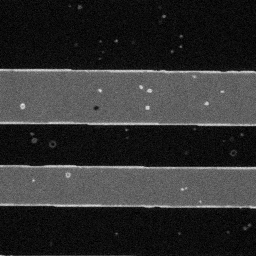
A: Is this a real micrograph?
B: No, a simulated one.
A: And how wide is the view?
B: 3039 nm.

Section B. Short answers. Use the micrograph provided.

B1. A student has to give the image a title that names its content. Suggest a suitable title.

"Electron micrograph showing lines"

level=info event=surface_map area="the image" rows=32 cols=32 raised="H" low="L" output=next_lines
LLLLLLLLLLLLLLLLLLLLLLLLLLLLLLLL
LLLLLLLLLLLLLLLLLLLLLLLLLLLLLLLL
LLLLLLLLLLLLLLLLLLLLLLLLLLLLLLLL
LLLLLLLLLLLLLLLLLLLLLLLLLLLLLLLL
LLLLLLLLLLLLLLLLLLLLLLLLLLLLLLLL
LLLLLLLLLLLLLLLLLLLLLLLLLLLLLLLL
LLLLLLLLLLLLLLLLLLLLLLLLLLLLLLLL
LLLLLLLLLLLLLLLLLLLLLLLLLLLLLLLL
LLLLLLLLLLLLLLLLLLLLLLLLLLLLLLLL
HHHHHHHHHHHHHHHHHHHHHHHHHHHHHHHH
HHHHHHHHHHHHHHHHHHHHHHHHHHHHHHHH
HHHHHHHHHHHHHHHHHHHHHHHHHHHHHHHH
HHHHHHHHHHHHHHHHHHHHHHHHHHHHHHHH
HHHHHHHHHHHHHHHHHHHHHHHHHHHHHHHH
HHHHHHHHHHHHHHHHHHHHHHHHHHHHHHHH
LLLLLLLLLLLLLHHHHHHHHHHHHHHHHHHH
LLLLLLLLLLLLLLLLLLLLLLLLLLLLLLLL
LLLLLLLLLLLLLLLLLLLLLLLLLLLLLLLL
LLLLLLLLLLLLLLLLLLLLLLLLLLLLLLLL
LLLLLLLLLLLLLLLLLLLLLLLLLLLLLLLL
LLLLLLLLLLLLLLLLLLLLLLLLLLLLLLLL
HHHHHHHHHHHHHHHHHHHHHHHHHHHHHHHH
HHHHHHHHHHHHHHHHHHHHHHHHHHHHHHHH
HHHHHHHHHHHHHHHHHHHHHHHHHHHHHHHH
HHHHHHHHHHHHHHHHHHHHHHHHHHHHHHHH
HHHHHHHHHHHHHHHHHHHHHHHHHHHHHHHH
LLLLLLLLLLLLLLLLLLLLLLLLLLLLLLLL
LLLLLLLLLLLLLLLLLLLLLLLLLLLLLLLL
LLLLLLLLLLLLLLLLLLLLLLLLLLLLLLLL
LLLLLLLLLLLLLLLLLLLLLLLLLLLLLLLL
LLLLLLLLLLLLLLLLLLLLLLLLLLLLLLLL
LLLLLLLLLLLLLLLLLLLLLLLLLLLLLLLL